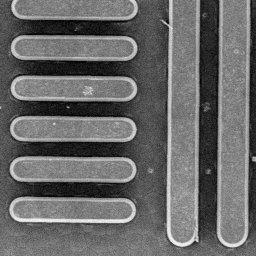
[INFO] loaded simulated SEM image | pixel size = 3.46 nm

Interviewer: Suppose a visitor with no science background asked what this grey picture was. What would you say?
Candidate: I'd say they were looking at groups of lines, slits or small figures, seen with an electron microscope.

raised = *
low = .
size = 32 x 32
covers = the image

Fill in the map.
..***************....****...***.
..***************....****...***.
.....................****...***.
.....................****...***.
.....................****...***.
..***************....****...***.
..***************....****...***.
.....................****...***.
.....................****...***.
.....................****...***.
..***************....****...***.
..***************....****...***.
.....................****...***.
.....................****...***.
.....................****..****.
..***************....****..****.
..***************....****..****.
...*************.....****..****.
.....................****..****.
.....................****..****.
..***************....****..****.
..***************....****..****.
...*************.....****..****.
.....................****..****.
.....................****..****.
..**************.....***...****.
.****************....***...****.
....************.....***...****.
.....................****..****.
.....................****..****.
......................*.....**..
................................